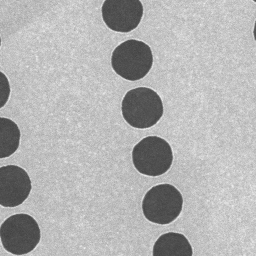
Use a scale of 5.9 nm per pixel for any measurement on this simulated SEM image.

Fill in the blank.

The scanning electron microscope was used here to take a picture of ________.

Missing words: holes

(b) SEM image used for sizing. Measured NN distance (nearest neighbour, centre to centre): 288 nm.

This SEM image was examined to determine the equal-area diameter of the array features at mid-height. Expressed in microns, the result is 0.243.